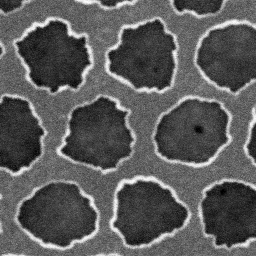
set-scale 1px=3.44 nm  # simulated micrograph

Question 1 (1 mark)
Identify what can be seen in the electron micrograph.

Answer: holes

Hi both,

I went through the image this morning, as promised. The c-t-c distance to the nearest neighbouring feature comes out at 306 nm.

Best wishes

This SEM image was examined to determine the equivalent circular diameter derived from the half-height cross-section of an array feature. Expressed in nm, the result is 238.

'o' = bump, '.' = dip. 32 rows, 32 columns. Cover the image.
...ooooooooo...ooooooo......oooo
.ooooooooooooooooooooo.o...ooooo
oooooo.oooooooooooo.oooooooooooo
oooo.....ooooooo.....oooooo.....
ooo........oooo......ooooo......
oo.........oooo.......ooo.......
oo.........ooo........ooo.......
ooo........ooo........oo........
ooo........oo.........ooo.......
oooo......oooo........oooo......
oooo......oooooo.....oooooo....o
oooooo.ooooooooooooooooooooooooo
...ooooooooo..ooooooooo..ooooooo
....oooooo.....ooooooo......oooo
....ooooo.......oooo.........ooo
.....oooo.......oooo........oooo
.....oooo.......ooo.........ooo.
.....ooo.........oo..........oo.
.....ooo........oooo........ooo.
.....ooo........oooo.......oooo.
....ooooooo....ooooooooo.ooooooo
o.oooooooooooooooooooooooooooooo
ooooooooooooooooo..ooooooooooooo
ooooo.....ooooo......ooooo......
oooo.......ooo........oooo......
ooo........oooo........oo.......
oo..........oo..........o.......
oo..........oo.........oo.......
ooo.........oo.........ooo......
oooo.......oooo.....ooooooo.....
oooooo...ooooooo...oooooooo...oo
oooooooooooooooooooooooooooooooo